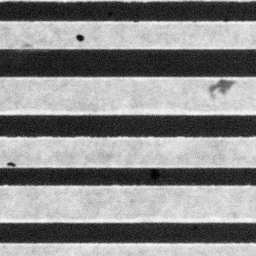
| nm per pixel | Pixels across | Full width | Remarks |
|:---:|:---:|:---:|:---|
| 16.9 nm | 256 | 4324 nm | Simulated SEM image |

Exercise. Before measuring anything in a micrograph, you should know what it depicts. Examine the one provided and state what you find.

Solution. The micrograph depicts lines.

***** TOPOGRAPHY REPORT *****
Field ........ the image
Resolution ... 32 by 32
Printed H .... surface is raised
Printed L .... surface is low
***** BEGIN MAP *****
LLLLLLLLLLLLLLLLLLLLLLLLLLLLLLLL
LLLLLLLLLLLLLLLLLLLLLLLLLLLLLLLL
LLLLLLLLLLLLLLLLLLLLLLLLLLLLLLLL
HHHHHHHHHHHHHHHHHHHHHHHHHHHHHHHH
HHHHHHHHHHHHHHHHHHHHHHHHHHHHHHHH
HHHHHHHHHHHHHHHHHHHHHHHHHHHHHHHH
LLLLLLLLLLLLLLLLLLLLLLLLLLLLLLLL
LLLLLLLLLLLLLLLLLLLLLLLLLLLLLLLL
LLLLLLLLLLLLLLLLLLLLLLLLLLLLLLLL
LLLLLLLLLLLLLLLLLLLLLLLLLLLLLLLL
HHHHHHHHHHHHHHHHHHHHHHHHHHHHHHHH
HHHHHHHHHHHHHHHHHHHHHHHHHHHHHHHH
HHHHHHHHHHHHHHHHHHHHHHHHHHHHHHHH
HHHHHHHHHHHHHHHHHHHHHHHHHHHHHHHH
LLLLLLLLLLLLLLLLLLLLLLLLLLLLLLLL
LLLLLLLLLLLLLLLLLLLLLLLLLLLLLLLL
LLLLLLLLLLLLLLLLLLLLLLLLLLLLLLLL
HHHHHHHHHHHHHHHHHHHHHHHHHHHHHHHH
HHHHHHHHHHHHHHHHHHHHHHHHHHHHHHHH
HHHHHHHHHHHHHHHHHHHHHHHHHHHHHHHH
HHHHHHHHHHHHHHHHHHHHHHHHHHHHHHHH
LLLLLLLLLLLLLLLLLLLLLLLLLLLLLLLL
LLLLLLLLLLLLLLLLLLLLLLLLLLLLLLLL
HHHHHHHHHHHHHHHHHHHHHHHHHHHHHHHH
HHHHHHHHHHHHHHHHHHHHHHHHHHHHHHHH
HHHHHHHHHHHHHHHHHHHHHHHHHHHHHHHH
HHHHHHHHHHHHHHHHHHHHHHHHHHHHHHHH
HHHHHHHHHHHHHHHHHLLLLHHHHHHHHHLH
LLLLLLLLLLLLLLLLLLLLLLLLLLLLLLLL
LLLLLLLLLLLLLLLLLLLLLLLLLLLLLLLL
LLLLLLLLLLLLLLLLLLLLLLLLLLLLLLLL
HHHHHHHHHHHHHHHHHHHHHHHHHHHHHHHH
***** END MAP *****